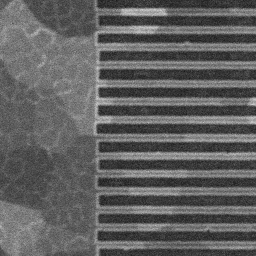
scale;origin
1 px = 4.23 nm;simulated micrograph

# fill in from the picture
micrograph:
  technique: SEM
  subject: parallel lines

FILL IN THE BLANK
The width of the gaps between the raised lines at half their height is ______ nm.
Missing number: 51.2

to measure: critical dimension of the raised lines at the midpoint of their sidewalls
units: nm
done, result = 22.2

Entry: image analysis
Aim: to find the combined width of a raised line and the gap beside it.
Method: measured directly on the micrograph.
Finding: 75.6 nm